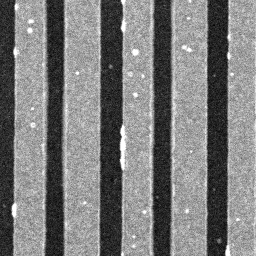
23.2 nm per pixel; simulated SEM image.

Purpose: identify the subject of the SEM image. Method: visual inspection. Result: lines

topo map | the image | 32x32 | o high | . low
..ooo...oooo...oooo...oooo...ooo
..ooo...oooo...oooo...oooo...ooo
..ooo...oooo...oooo...oooo...ooo
..oooo..oooo...oooo...oooo...ooo
..oooo..ooooo...ooo...oooo...ooo
..oooo..ooooo..oooo...oooo...ooo
..oooo..ooooo..oooo...oooo...ooo
..ooo...ooooo..oooo...oooo...ooo
..ooo...oooo...oooo...oooo...ooo
..ooo...oooo...oooo...oooo...ooo
..ooo...oooo...oooo...oooo...ooo
..oooo..oooo...oooo...oooo...ooo
..oooo..oooo...oooo...oooo...ooo
..ooo...oooo...oooo...oooo...ooo
..ooo...oooo...oooo...oooo...ooo
..oooo..oooo...oooo...oooo...ooo
..ooo...oooo...oooo...oooo...ooo
..ooo...oooo...oooo...oooo...ooo
..ooo...oooo...oooo...oooo...ooo
..ooo...oooo...oooo...oooo...ooo
..ooo...oooo...oooo...oooo...ooo
..ooo...oooo...oooo...oooo...ooo
..ooo...oooo...oooo...oooo...ooo
..ooo...oooo...oooo...oooo...ooo
..ooo...oooo...oooo...oooo...ooo
..ooo...oooo...oooo...oooo...ooo
..ooo...oooo...oooo...oooo...ooo
..ooo...oooo...oooo...oooo...ooo
..oooo..oooo...oooo...oooo...ooo
..ooo...oooo...oooo...oooo...ooo
..ooo...oooo...oooo...oooo...ooo
..ooo...oooo...oooo...oooo..oooo